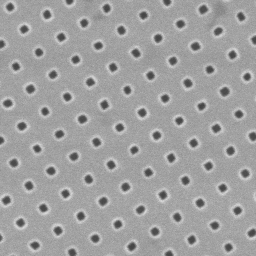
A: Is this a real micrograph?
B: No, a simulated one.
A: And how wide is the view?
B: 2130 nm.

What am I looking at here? a regular array of holes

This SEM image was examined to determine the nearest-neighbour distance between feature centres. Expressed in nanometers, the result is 221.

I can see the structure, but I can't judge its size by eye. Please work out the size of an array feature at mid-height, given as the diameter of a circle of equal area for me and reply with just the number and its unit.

0.0768 microns